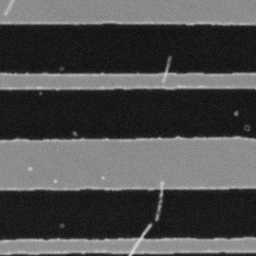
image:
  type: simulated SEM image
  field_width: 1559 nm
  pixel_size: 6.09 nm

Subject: lines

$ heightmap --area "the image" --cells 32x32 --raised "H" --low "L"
HHHHHHHHHHHHHHHHHHHHHHHHHHHHHHHH
HHHHHHHHHHHHHHHHHHHHHHHHHHHHHHHH
HHHHHHHHHHHHHHHHHHHHHHHHHHHHHHHH
LLLLLLLLLLLLLLLLLLLLLLLLLLLLLLLL
LLLLLLLLLLLLLLLLLLLLLLLLLLLLLLLL
LLLLLLLLLLLLLLLLLLLLLLLLLLLLLLLL
LLLLLLLLLLLLLLLLLLLLLLLLLLLLLLLL
LLLLLLLLLLLLLLLLLLLLLLLLLLLLLLLL
LLLLLLLLLLLLLLLLLLLLLLLLLLLLLLLL
HHHHHHHHHHHHHHHHHHHHHHHHHHHHHHHH
HHHHHHHHHHHHHHHHHHHHHHHHHHHHHHHH
LLLLLLLLLLLLLLLLLLLLLLLLLLLLLLLL
LLLLLLLLLLLLLLLLLLLLLLLLLLLLLLLL
LLLLLLLLLLLLLLLLLLLLLLLLLLLLLLLL
LLLLLLLLLLLLLLLLLLLLLLLLLLLLLLLL
LLLLLLLLLLLLLLLLLLLLLLLLLLLLLLLL
LLLLLLLLLLLLLLLLLLLLLLLLLLLLLLLL
LHHHLHHHHHHHHHHHHHHHHHHHHHHHHHHH
HHHHHHHHHHHHHHHHHHHHHHHHHHHHHHHH
HHHHHHHHHHHHHHHHHHHHHHHHHHHHHHHH
HHHHHHHHHHHHHHHHHHHHHHHHHHHHHHHH
HHHHHHHHHHHHHHHHHHHHHHHHHHHHHHHH
HHHHHHHHHHHHHHHHHHHHHHHHHHHHHHHH
HHHHHHHHHHHHHHHHHHHHHHHHHHHHHLLL
LLLLLLLLLLLLLLLLLLLLLLLLLLLLLLLL
LLLLLLLLLLLLLLLLLLLLLLLLLLLLLLLL
LLLLLLLLLLLLLLLLLLLLLLLLLLLLLLLL
LLLLLLLLLLLLLLLLLLLLLLLLLLLLLLLL
LLLLLLLLLLLLLLLLLLLLLLLLLLLLLLLL
LLLLLLLLLLLLLLLLLLLLLLLLLLLLLLLL
HHHHHHHHHHHHHHHHHHHHHHHHHHHHHHHH
HHHHHHHHHHHHHHHHHHHHHHHHHHHHHHHH